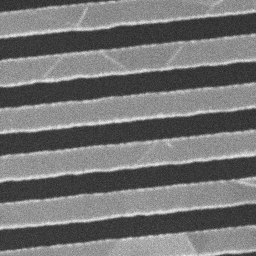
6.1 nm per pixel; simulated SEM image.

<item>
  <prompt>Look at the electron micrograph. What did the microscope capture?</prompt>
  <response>lines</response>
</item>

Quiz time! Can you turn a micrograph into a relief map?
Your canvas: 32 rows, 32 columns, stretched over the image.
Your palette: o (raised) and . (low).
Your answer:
...........ooooooooooooooooooooo
.ooooooooooooooooooooooooooooooo
oooooooooooooooooooooo..........
oooooooooooooo..................
oo............................oo
....................oooooooooooo
...........ooooooooooooooooooooo
.ooooooooooooooooooooooooooooooo
oooooooooooooooooooooo..........
ooooooooooooo...................
ooo............................o
.....................ooooooooooo
............oooooooooooooooooooo
..oooooooooooooooooooooooooooooo
oooooooooooooooooooooo..........
oooooooooooo....................
oo............................oo
....................oooooooooooo
..........oooooooooooooooooooooo
.ooooooooooooooooooooooooooooooo
ooooooooooooooooooooo...........
ooooooooooo.....................
ooo...........................oo
...................ooooooooooooo
.........ooooooooooooooooooooooo
ooooooooooooooooooooooooooooooo.
oooooooooooooooooooooo..........
oooooooooooo....................
o............................ooo
...................ooooooooooooo
.........ooooooooooooooooooooooo
ooooooooooooooooooooooooooooooo.